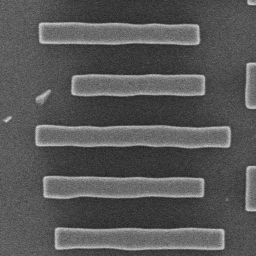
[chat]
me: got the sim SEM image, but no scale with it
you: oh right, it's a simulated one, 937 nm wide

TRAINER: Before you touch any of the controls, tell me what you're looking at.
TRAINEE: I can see groups of lines, slits or small figures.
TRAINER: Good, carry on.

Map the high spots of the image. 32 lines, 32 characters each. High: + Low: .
...............................+
................................
................................
.....++++++++++++++++++++.......
.....++++++++++++++++++++.......
............+++......++++.......
................................
................................
...............................+
.........++++++++++++++++......+
.........+++++++++++++++++.....+
.........+++++++++++++++++.....+
...............................+
...............................+
................................
................................
....+++++++++++++++++++++++++...
....+++++++++++++++++++++++++...
................................
................................
................................
...............................+
......+++++++++++++++++++......+
......+++++++++++++++++++......+
......+++++++++++++++++++......+
...............................+
................................
................................
.......+........................
.......+++++++++++++++++++++....
.......+++++++++++++++++++++....
................................